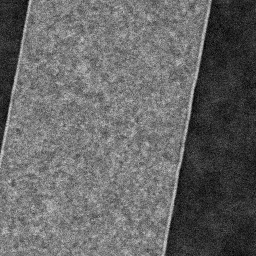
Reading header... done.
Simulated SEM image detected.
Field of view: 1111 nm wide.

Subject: one or a few lines or trenches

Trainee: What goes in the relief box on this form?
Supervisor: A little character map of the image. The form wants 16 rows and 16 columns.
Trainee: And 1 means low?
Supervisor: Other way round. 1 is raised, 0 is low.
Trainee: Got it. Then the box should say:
0011111111111000
0011111111111000
0111111111111000
0111111111111000
0111111111110000
0111111111110000
0111111111110000
1111111111110000
1111111111110000
1111111111100000
1111111111100000
1111111111100000
1111111111100000
1111111111100000
1111111111000000
1111111111000000